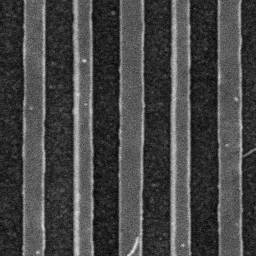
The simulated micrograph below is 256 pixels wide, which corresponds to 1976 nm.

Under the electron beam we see lines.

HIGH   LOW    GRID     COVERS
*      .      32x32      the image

...***...**....***....**...***..
...***...**....***....**...***..
...***...**....***....**...***..
...***...**....***....**...***..
...***...**....***....**...***..
...***...**....***....**...***..
...***...**....***....**...***..
...***...**....***....**...***..
...***...**....***....**...***..
...***...**....***....**...***..
...***...**....***....**...***..
...***...**....***....**...***..
...***...**....***....**...***..
...***...**....***....**...***..
...***...**....***....**...***..
...***...**....***....**...***..
...***...**....***....**...***..
...**....**....***....**...***..
...**....**....***....**...***..
...***...**....***....**...***..
...***...**....***....**...***..
...***...***...***....**...***..
...**....***...***....**...***..
...**....**....***....**...***..
...**....**....***....**...***..
...**....***...***....**...***..
...**....***...***....**...***..
...**....***...***....**...***..
...***...**....***....**...***..
...***...**....***....**...***..
...***...***...***....**...***..
...***...***...***....**...***..